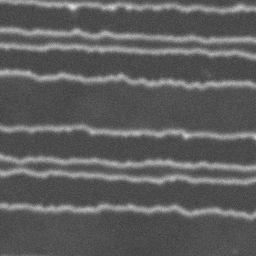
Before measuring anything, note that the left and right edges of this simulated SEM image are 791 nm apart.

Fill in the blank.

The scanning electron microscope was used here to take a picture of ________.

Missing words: lines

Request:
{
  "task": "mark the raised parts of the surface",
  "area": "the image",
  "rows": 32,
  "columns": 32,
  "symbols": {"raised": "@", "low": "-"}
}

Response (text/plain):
-----@@@@@@@@@@@@@@@@@@@@@@@@@@@
---------------------------@----
--------------------------------
--------------------------------
@@@@@@@@@@@@@@@@@@--------------
@@@@@@@@@@@@@@@@@@@@@@@@@@@@@@@@
------------------@@@--@-@@@@@@@
--------------------------------
--------------------------------
@@@@---@@-----------------------
@@@@@@@@@@@@@@@@@@@@@@@-@-@@@@@@
@@@@@@@@@@@@@@@@@@@@@@@@@@@@@@@@
@@@@@@@@@@@@@@@@@@@@@@@@@@@@@@@@
@@@@@@@@@@@@@@@@@@@@@@@@@@@@@@@@
@@@@@@@@@@@@@@@@@@@@@@@@@@@@@@@@
@@@@@@@@@@@@@@@@@@@@@@@@@@@@@@@@
-----------@@@@@@@@@@@@@@@@@@@@@
--------------------------------
--------------------------------
--------------------------------
@@@@@@@@@@@@@@@@@@@@@@@--@------
@@-@@@@@@@@@@@@@@@@@@@@@@@@@@@@@
----------------@@@@@--@@@@@@@@@
--------------------------------
--------------------------------
--------------------------------
@@@@@@@@@@@@@@@@@@@@@@@-@@@@@---
@@@@@@@@@@@@@@@@@@@@@@@@@@@@@@@@
@@@@@@@@@@@@@@@@@@@@@@@@@@@@@@@@
@@@@@@@@@@@@@@@@@@@@@@@@@@@@@@@@
@@@@@@@@@@@@@@@@@@@@@@@@@@@@@@@@
@@@@@@@@@@@@@@@@@@@@@@@@@@@@@@@@